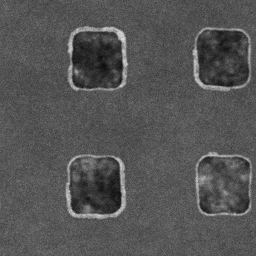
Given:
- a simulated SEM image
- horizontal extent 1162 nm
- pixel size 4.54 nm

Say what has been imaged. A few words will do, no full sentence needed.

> holes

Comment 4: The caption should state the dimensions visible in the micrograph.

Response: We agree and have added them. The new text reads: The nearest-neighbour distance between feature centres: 572 nm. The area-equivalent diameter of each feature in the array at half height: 273 nm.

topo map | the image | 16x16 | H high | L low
HHHHHHHHHHHHHHHH
HHHHHHHHHHHHHHHH
HHHHHLLHHHHHLLLL
HHHHLLLLHHHHLLLL
HHHHLLLLHHHHLLLL
HHHHHLLHHHHHHHHH
HHHHHHHHHHHHHHHH
HHHHHHHHHHHHHHHH
HHHHHHHHHHHHHHHH
HHHHHHHHHHHHHHHH
HHHHLLLHHHHHLLLL
HHHHLLLLHHHHLLLL
HHHHLLLLHHHHLLLL
HHHHHHHHHHHHHHHH
HHHHHHHHHHHHHHHH
HHHHHHHHHHHHHHHH